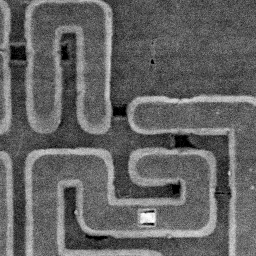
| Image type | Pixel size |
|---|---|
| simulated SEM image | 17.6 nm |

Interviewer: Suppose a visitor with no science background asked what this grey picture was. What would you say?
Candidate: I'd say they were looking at wiring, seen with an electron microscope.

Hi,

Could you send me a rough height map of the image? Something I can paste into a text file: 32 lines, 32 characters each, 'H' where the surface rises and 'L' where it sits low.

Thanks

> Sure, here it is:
LLLLHHHHHHHHHLLLLLLLLLLLLLLLLLLL
HLLLHHHHHHHHHHLLLLLLLLLLLLLLLLLL
HLLLHHHHHHHHHHLLLLLLLLLLLLLLLLLL
HLLLHHHHHHHHHHLLLLLLLLLLLLLLLLLL
HLLLHHHLLLHHHHLLLLLLLLLLLLLLLLLL
HLLLHHHLLLHHHHLLLLLLLLLLLLLLLLLL
LLLLHHHLLLHHHHLLLLLLLLLLLLLLLLLL
HLLLHHHLLLHHHHLLLLLLLLLLLLLLLLLL
HLLLHHHLLLHHHHLLLLLLLLLLLLLLLLLL
HLLLHHHLLLHHHHLLLLLLLLLLLLLLLLLL
HLLLHHHLLLHHHLLLLLLLLLLLLLLLLLLL
HLLLHHHLLLHHHLLLLLLLLLLLLLLLLLLL
HLLLHHHLLLHHHHLLLLLLLLLLHHHHHHHL
HLLLHHHLLLHHHHLLHHHHHHHHHHHHHHHH
HLLLHHHLLLHHHHLLHHHHHHHHHHHHHHHH
HLLLHHHLLLHHHLLLLHHHHHHHHHHHHHHH
LLLLLLLLLLLLLLLLLLLLLLLLLLLLLHHH
LLLLLLLLLLLLLLLLLLLLLLLLLLLLLHHH
LLLLLLLLLLLLLLLLLLLLLLLLLLLLLHHH
LLLLHHHHHHHHHLLLLHHHHHHHHHLLLHHH
HLLLHHHHHHHHHHLLHHHHHHHHHHHLLHHH
HLLLHHHHHHHHHHLLHHHHHHHHHHHLLHHH
HLLLHHHHHHHHHHLLLHHHHHHHHHHLLHHH
HLLLHHHHLLHHHHLLLLLLLLLHHHHLLHHH
HLLLHHHHLLHHHHLLLLLLLLLHHHHLLHHH
HLLLHHHHLLHHHHHHHHHHHHHHHHHLLHHH
HLLLHHHHLLHHHHHHHHLHHHHHHHHLLHHH
HLLLHHHHLLHHHHHHHLLHHHHHHHHLLHHH
HLLLHHHHLLLHHHHHHHHHHHHHHHLLLHHH
HLLLHHHHLLLLLLLLLLLLLLLLLLLLLHHH
HLLLHHHHLLLLLLLLLLLLLLLLLLLLLHHH
HLLLHHHHLLLLLLLLLLLLLLLLLLLLLHHH